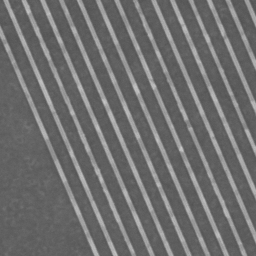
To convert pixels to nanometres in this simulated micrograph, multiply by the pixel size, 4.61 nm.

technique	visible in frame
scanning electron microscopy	parallel lines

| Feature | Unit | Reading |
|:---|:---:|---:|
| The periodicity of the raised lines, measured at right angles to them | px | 17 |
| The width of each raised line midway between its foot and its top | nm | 12.2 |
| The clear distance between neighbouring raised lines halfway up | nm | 64.1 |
